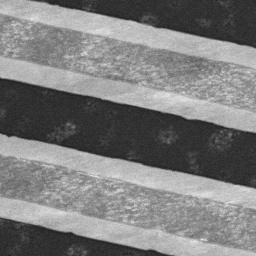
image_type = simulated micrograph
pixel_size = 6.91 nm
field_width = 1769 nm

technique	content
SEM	one or a few lines or trenches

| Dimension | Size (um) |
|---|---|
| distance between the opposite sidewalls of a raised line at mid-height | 0.415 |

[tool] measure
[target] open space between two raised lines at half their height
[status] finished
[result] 531 nm